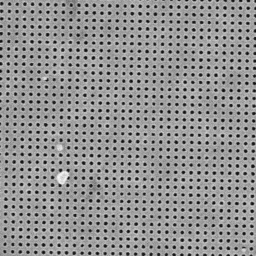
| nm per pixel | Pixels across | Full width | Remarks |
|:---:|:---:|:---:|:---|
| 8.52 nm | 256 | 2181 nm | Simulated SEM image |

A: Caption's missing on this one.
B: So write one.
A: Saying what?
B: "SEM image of a regular array of holes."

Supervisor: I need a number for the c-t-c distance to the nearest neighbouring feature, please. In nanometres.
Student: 62.2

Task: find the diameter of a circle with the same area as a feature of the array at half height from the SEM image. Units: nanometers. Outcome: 31.9